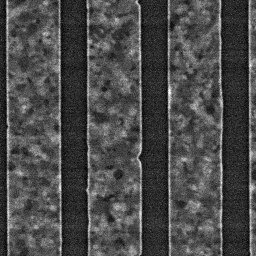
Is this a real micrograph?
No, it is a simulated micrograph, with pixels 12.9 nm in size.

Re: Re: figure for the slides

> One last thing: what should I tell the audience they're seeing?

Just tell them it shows one or a few lines or trenches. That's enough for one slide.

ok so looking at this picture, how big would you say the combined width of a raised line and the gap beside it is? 1040 nanometres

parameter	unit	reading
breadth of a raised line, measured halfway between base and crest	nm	681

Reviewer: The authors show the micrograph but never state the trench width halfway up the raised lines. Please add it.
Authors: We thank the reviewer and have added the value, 0.362 um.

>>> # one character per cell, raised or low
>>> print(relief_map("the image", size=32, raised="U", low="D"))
DUUUUUUDDDDUUUUUUDDDDUUUUUUUDDDU
DUUUUUUDDDDUUUUUUDDDDUUUUUUDDDDU
DUUUUUUDDDDUUUUUUDDDDUUUUUUUDDDU
DUUUUUUDDDDUUUUUUDDDDUUUUUUUDDDU
DUUUUUUDDDDUUUUUUDDDDUUUUUUUDDDU
DUUUUUUDDDDUUUUUUDDDDUUUUUUUDDDU
DUUUUUUDDDDUUUUUUUDDDUUUUUUUDDDU
DUUUUUUDDDDUUUUUUUDDDUUUUUUUDDDU
DUUUUUUDDDDUUUUUUUDDDUUUUUUUDDDU
DUUUUUUDDDDUUUUUUUDDDUUUUUUUDDDU
DUUUUUUDDDDUUUUUUUDDDUUUUUUUDDDU
DUUUUUUDDDDUUUUUUUDDDUUUUUUUDDDU
DUUUUUUDDDDUUUUUUUDDDUUUUUUUDDDU
DUUUUUUDDDDUUUUUUUDDDUUUUUUUDDDU
DUUUUUUDDDDUUUUUUUDDDUUUUUUUDDDU
DUUUUUUDDDDUUUUUUUDDDUUUUUUUDDDU
DUUUUUUDDDDUUUUUUUDDDUUUUUUUDDDU
DUUUUUUDDDDUUUUUUUDDDUUUUUUUDDDU
DUUUUUUUDDDUUUUUUUDDDUUUUUUUDDDU
DUUUUUUUDDDUUUUUUDDDDUUUUUUUDDDU
DUUUUUUUDDDUUUUUUUDDDUUUUUUUDDDU
DUUUUUUUDDDUUUUUUUDDDUUUUUUUDDDU
DUUUUUUUDDDUUUUUUUDDDUUUUUUUDDDU
DUUUUUUDDDDUUUUUUUDDDUUUUUUUDDDU
DUUUUUUUDDDUUUUUUUDDDUUUUUUUDDDU
DUUUUUUUDDDUUUUUUUDDDUUUUUUUDDDU
DUUUUUUUDDDUUUUUUDDDDUUUUUUUDDDU
DUUUUUUUDDDUUUUUUUDDDUUUUUUUDDDU
DUUUUUUUDDDUUUUUUUDDDUUUUUUUDDDU
DUUUUUUUDDDUUUUUUUDDDUUUUUUUDDDU
DUUUUUUUDDDUUUUUUUDDDUUUUUUUDDDU
DUUUUUUUDDDUUUUUUUDDDUUUUUUUDDDU